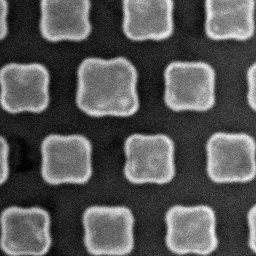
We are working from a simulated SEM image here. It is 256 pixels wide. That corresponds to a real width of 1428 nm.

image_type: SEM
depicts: a regular array of raised bodies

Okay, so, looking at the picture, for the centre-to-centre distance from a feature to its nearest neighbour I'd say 459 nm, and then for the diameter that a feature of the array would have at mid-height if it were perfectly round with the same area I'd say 282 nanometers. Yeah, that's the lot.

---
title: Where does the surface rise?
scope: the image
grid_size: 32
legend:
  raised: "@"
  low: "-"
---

@----@@@@@@-----@@@@@-----@@@@@@
@----@@@@@@-----@@@@@-----@@@@@@
@----@@@@@@-----@@@@@-----@@@@@-
@----@@@@@@-----@@@@@-----@@@@@@
------@@@@@-----@@@@@-----@@@@@-
--------------------------------
--------------------------------
-----------@@-@@----------------
-@@@@-----@@@@@@@----@@@@@------
@@@@@@----@@@@@@@----@@@@@@----@
@@@@@@----@@@@@@@----@@@@@@----@
@@@@@@----@@@@@@@----@@@@@@----@
@@@@@@----@@@@@@@----@@@@@@----@
-@@@@-----@@@@@@@-----@-@@------
--------------------------------
--------------------------------
--------------------------------
------@@@@@-----@@@@@-----@@@@@-
@----@@@@@@-----@@@@@@----@@@@@@
@----@@@@@@-----@@@@@-----@@@@@@
@----@@@@@@-----@@@@@-----@@@@@@
@----@@@@@@-----@@@@@@----@@@@@@
@-----@@@@@-----@@@@@------@@-@-
--------------------------------
--------------------------------
--------------------------------
-@@@@------@@@@@-----@@@@@-----@
@@@@@@----@@@@@@-----@@@@@@----@
@@@@@@-----@@@@@-----@@@@@@----@
@@@@@@-----@@@@@-----@@@@@@----@
@@@@@@-----@@@@@-----@@@@@@----@
-@@@@@------@@@@------@-@@------